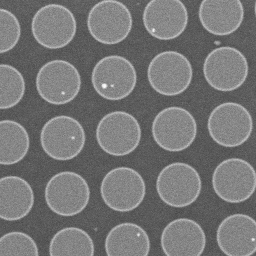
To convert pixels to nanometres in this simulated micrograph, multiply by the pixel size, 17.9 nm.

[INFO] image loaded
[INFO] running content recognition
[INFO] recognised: an array of small figures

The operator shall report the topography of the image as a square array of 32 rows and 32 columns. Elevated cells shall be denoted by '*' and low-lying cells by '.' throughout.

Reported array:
............***....****..*****..
*....****..*****..*****..*****..
**..*****..*****..*****..*****..
**..*****..*****..*****...****..
**..*****...****...***..........
**...***........................
...........................***..
.............***...****...*****.
**...****...*****..*****.******.
***..*****..*****..*****..*****.
***..*****..*****..*****..****..
***..*****..****....***.........
**....***.......................
*....................*.....***..
.............***....****..*****.
**....****..*****..*****..*****.
***..*****..*****..*****..*****.
****.******.*****..*****...****.
***..*****...****....**.........
***...***.......................
......................*.....***.
..............***...****...*****
***...****...*****..*****..*****
****..*****..*****..*****..*****
****..*****..*****..*****..****.
****..*****..****....***........
***....***......................
......................**....****
..............****...****..*****
***....****..*****..******.*****
****..******.******.******.*****
*****.******.*****...****...****